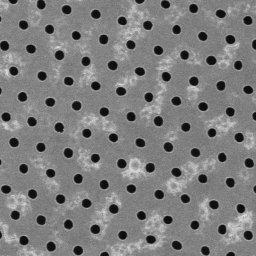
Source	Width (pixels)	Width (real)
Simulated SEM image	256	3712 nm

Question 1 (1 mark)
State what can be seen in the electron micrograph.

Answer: a regular array of holes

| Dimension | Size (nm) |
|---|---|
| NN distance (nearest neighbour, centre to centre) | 382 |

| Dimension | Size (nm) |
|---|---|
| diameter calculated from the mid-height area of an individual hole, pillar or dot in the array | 137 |